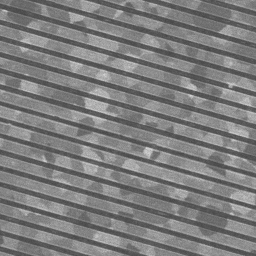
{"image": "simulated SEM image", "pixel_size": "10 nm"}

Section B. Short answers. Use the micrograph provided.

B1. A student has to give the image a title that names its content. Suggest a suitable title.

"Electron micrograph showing parallel lines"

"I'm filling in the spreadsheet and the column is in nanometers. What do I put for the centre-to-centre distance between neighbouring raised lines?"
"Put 156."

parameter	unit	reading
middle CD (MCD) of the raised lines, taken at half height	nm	97.7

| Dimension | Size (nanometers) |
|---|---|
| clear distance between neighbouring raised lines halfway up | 57.8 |